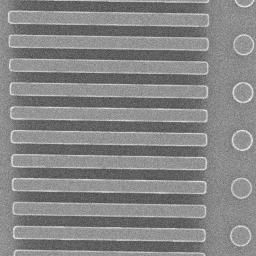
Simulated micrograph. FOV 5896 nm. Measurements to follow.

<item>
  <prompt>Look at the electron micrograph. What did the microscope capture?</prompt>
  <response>groups of lines, slits or small figures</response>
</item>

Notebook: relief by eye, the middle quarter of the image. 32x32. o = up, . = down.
oooooooooooooooooooooooooooooooo
oooooooooooooooooooooooooooooooo
................................
................................
................................
oooooooooooooooooooooooooooooooo
oooooooooooooooooooooooooooooooo
oooooooooooooooooooooooooooooooo
................................
................................
................................
oooooooooooooooooooooooooooooo..
oooooooooooooooooooooooooooooooo
oooooooooooooooooooooooooooooooo
................................
................................
................................
oooooooooooooooooooooooooooooooo
oooooooooooooooooooooooooooooooo
oooooooooooooooooooooooooooooooo
................................
................................
................................
oooooooooooooooooooooooooooooooo
oooooooooooooooooooooooooooooooo
oooooooooooooooooooooooooooooooo
................................
................................
................................
oooooooooooooooooooooooooooooooo
oooooooooooooooooooooooooooooooo
oooooooooooooooooooooooooooooooo